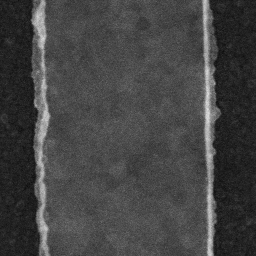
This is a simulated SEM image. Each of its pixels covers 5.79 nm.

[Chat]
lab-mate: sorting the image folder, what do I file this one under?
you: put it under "one or a few lines or trenches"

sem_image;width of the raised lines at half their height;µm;0.952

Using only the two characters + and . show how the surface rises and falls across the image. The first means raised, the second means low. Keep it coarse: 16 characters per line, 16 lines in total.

...++++++++++...
...++++++++++...
...++++++++++...
...++++++++++...
...++++++++++...
...++++++++++...
...++++++++++...
...++++++++++...
...++++++++++...
...++++++++++...
...++++++++++...
...++++++++++...
...++++++++++...
...++++++++++...
...++++++++++...
...++++++++++...